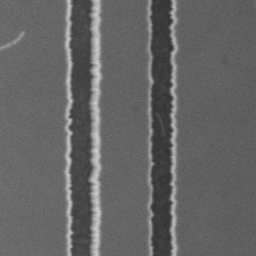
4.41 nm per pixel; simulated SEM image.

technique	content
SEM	lines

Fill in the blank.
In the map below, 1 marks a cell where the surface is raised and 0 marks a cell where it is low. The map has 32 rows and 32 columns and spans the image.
11111111100011111110011111111111
11111111100011111110011111111111
11111111100011111110001111111111
11111111100011111110011111111111
11111111100011111110011111111111
11111111100011111110001111111111
11111111100011111110001111111111
11111111100011111110011111111111
11111111100011111110001111111111
11111111100011111110011111111111
11111111100011111110011111111111
11111111100011111110011111111111
11111111100011111110001111111111
11111111100011111110001111111111
11111111100011111110011111111111
11111111100011111110011111111111
11111111100011111110001111111111
11111111100011111110011111111111
11111111100011111110011111111111
11111111100011111110001111111111
11111111100011111110011111111111
11111111100011111110011111111111
11111111100111111110011111111111
11111111100011111110011111111111
11111111100011111110011111111111
11111111100011111110011111111111
11111111100011111110011111111111
11111111100011111110011111111111
11111111100011111110011111111111
11111111100011111110011111111111
11111111100011111110011111111111
11111111100011111110011111111111